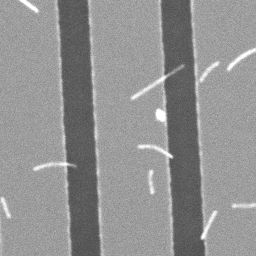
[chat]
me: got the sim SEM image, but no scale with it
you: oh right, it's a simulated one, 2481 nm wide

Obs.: lines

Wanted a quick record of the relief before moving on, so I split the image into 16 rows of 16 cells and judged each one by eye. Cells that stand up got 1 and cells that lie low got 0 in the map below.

1111001111001111
1111001111001111
1111001111001111
1111001111001111
1111001111001111
1111001111001111
1111001111001111
1111001111001111
1111001111001111
1111001111100111
1111001111100111
1111001111100111
1111001111100111
1111001111100111
1111001111100111
1111001111100111